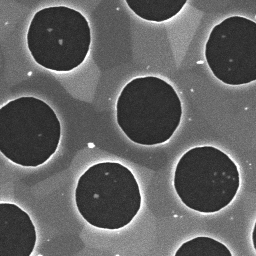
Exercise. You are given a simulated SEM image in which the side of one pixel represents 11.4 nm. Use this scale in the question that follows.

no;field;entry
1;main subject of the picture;holes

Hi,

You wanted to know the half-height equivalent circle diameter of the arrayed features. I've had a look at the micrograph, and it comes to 0.758 µm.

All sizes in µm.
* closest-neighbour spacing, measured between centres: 1.05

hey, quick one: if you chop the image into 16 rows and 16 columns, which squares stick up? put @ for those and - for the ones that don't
@@@-@@@@---@@@@@
@@---@@@@@@@@@--
@@----@@@@@@@---
@@---@@@@@@@@---
@@@@@@@@@@@@@---
@@@@@@@@---@@@@@
---@@@@----@@@@@
----@@@----@@@@@
----@@@@---@@@@@
---@@@@@@@@@--@@
@@@@@@--@@@----@
@@@@@----@@----@
@@@@@----@@---@@
--@@@---@@@@@@@@
--@@@@@@@@@@@@@@
--@@@@@@@@@---@@